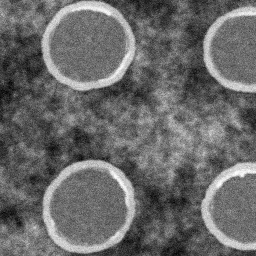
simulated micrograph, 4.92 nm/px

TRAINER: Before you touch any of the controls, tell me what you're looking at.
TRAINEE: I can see raised bodies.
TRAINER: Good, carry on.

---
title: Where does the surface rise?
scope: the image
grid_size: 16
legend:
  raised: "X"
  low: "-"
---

----XXX---------
---XXXXX------XX
---XXXXX-----XXX
---XXXXX-----XXX
---XXXXX-----XXX
---------------X
----------------
----------------
----------------
----------------
-----XX--------X
---XXXXX-----XXX
---XXXXX-----XXX
---XXXXX-----XXX
---XXXXX-----XXX
----XX----------